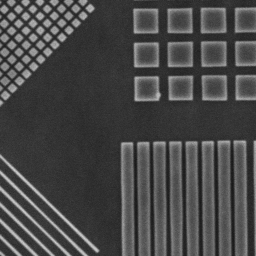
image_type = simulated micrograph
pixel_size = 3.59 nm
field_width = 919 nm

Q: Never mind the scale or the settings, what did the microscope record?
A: groups of lines, slits or small figures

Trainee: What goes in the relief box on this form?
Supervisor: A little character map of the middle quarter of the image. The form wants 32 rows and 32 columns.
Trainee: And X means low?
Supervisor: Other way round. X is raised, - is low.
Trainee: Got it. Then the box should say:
------------------XXXXXX--XXXXXX
--------------------------------
--------------------------------
------------------XXXXXX--XXXXXX
------------------XXXXXX--XXXXXX
------------------XXXXXX--XXXXXX
------------------XXXXXX--XXXXXX
------------------XXXXXX--XXXXXX
------------------XXXXXX--XXXXXX
--------------------------------
--------------------------------
--------------------------------
--------------------------------
--------------------------------
--------------------------------
--------------------------------
--------------------------------
--------------------------------
--------------------------------
--------------------------------
--------------XXX-XXX--XX-XXX--X
--------------XXX-XXX--XX-XXX--X
--------------XXX-XXX--XX-XXX--X
--------------XXX-XXX--XX--XX--X
--------------XXX-XXX--XX--XX--X
--------------XXX-XXX--XX--XX--X
--------------XXX-XXX--XX--XX--X
--------------XXX-XXX--XX--XX--X
--------------XXX-XXX--XX--XX--X
--------------XXX-XXX--XX--XX--X
--------------XXX-XXX--XX--XX--X
---------------XX-XXX--XX--XX--X